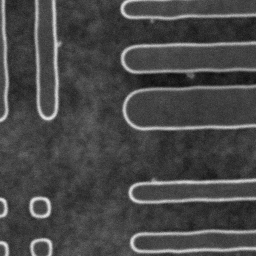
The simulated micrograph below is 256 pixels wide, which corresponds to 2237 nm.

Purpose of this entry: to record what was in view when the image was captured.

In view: groups of lines, slits or small figures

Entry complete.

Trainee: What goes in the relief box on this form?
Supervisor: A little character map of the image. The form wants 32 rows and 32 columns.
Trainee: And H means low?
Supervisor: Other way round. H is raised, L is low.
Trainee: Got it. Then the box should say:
LLLLLHHLLLLLLLLHHHHHHHHHHHHHHHHH
LLLLLHHLLLLLLLLHHHHHHHHHHHHHHHHH
LLLLLHHLLLLLLLLLLLLLLLLLLLLLLLLL
LLLLLHHLLLLLLLLLLLLLLLLLLLLLLLLL
HLLLLHHLLLLLLLLLLLLLLLLLLLLLLLLL
HLLLLHHLLLLLLLLLLLLLLLLLLLLLHHHH
HLLLLHHLLLLLLLLLHHHHHHHHHHHHHHHH
HLLLLHHLLLLLLLLHHHHHHHHHHHHHHHHH
HLLLLHHLLLLLLLLLHHHHHHHHHHHHHHHH
HLLLLHHLLLLLLLLLLLLLLLLLLLLLLLLL
HLLLLHHLLLLLLLLLLLLLLLLLLLLLLLLL
HLLLLHHLLLLLLLLLLHHHHHHHHHHHHHHH
HLLLLHHLLLLLLLLLHHHHHHHHHHHHHHHH
HLLLLHHLLLLLLLLLHHHHHHHHHHHHHHHH
HLLLLHHLLLLLLLLLHHHHHHHHHHHHHHHH
LLLLLLLLLLLLLLLLHHHHHHHHHHHHHHHH
LLLLLLLLLLLLLLLLLLLLLLLLLLLLLLLL
LLLLLLLLLLLLLLLLLLLLLLLLLLLLLLLL
LLLLLLLLLLLLLLLLLLLLLLLLLLLLLLLL
LLLLLLLLLLLLLLLLLLLLLLLLLLLLLLLL
LLLLLLLLLLLLLLLLLLLLLLLLLLLLLLLL
LLLLLLLLLLLLLLLLLLLLLLLLLLLLLLLL
LLLLLLLLLLLLLLLLLLLLLLLLLLLLLLLL
LLLLLLLLLLLLLLLLHHHHHHHHHHHHHHHH
LLLLLLLLLLLLLLLLHHHHHHHHHHHHHHHH
HLLLHHLLLLLLLLLLLLLLLLLLLLLLLLLL
HLLLHHLLLLLLLLLLLLLLLLLLLLLLLLLL
LLLLLLLLLLLLLLLLLLLLLLLLLLLLLLLL
LLLLLLLLLLLLLLLLLLLLLLLLLLLLLLLL
LLLLLLLLLLLLLLLLLHHHHHHHHHHHHHHH
LLLLHHLLLLLLLLLLLHHHHHHHHHHHHHHH
HLLLHHLLLLLLLLLLLLLLLLLLLLLLLLLL